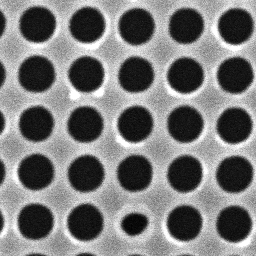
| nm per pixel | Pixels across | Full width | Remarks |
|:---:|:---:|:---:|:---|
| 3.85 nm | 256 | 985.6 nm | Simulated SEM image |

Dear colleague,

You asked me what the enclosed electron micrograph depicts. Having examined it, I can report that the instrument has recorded a regular array of holes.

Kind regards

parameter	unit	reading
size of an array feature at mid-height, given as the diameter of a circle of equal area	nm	143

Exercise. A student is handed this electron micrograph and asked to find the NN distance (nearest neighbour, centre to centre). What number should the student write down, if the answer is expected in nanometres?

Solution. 188